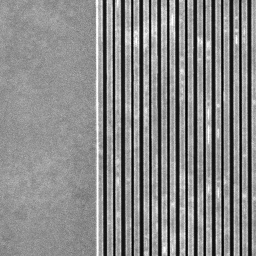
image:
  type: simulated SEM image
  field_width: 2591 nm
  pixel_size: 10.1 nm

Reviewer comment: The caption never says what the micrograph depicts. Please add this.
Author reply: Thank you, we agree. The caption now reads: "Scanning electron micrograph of parallel lines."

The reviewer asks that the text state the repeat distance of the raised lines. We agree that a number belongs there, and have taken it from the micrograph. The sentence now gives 0.0916 microns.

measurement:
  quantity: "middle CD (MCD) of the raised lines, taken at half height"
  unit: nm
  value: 59.5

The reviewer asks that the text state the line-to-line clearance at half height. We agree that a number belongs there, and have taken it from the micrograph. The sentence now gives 0.0392 µm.